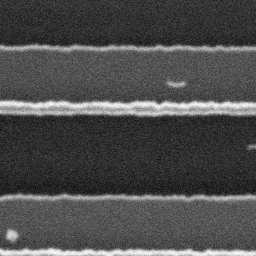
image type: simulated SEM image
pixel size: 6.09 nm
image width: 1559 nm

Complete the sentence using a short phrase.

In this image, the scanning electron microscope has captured lines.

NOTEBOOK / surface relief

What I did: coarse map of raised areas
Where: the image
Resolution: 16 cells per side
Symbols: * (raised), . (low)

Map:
................
................
................
****************
****************
****************
****************
................
................
................
................
................
****************
****************
****************
****************